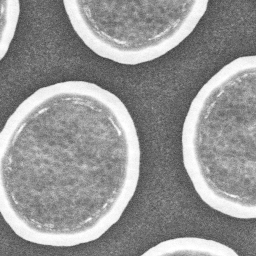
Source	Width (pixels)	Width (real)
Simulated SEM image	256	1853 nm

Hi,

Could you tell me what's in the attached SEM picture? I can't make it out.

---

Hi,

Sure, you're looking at raised bodies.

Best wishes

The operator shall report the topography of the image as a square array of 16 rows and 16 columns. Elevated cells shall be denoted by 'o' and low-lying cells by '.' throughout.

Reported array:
o....ooooooo....
o....ooooooo....
......ooooo.....
.......oo.......
..............oo
....o........ooo
..ooooo.....oooo
.ooooooo....oooo
oooooooo....oooo
oooooooo....oooo
oooooooo....oooo
oooooooo....oooo
oooooooo.....ooo
.oooooo.........
..oooo..........
..........ooo...